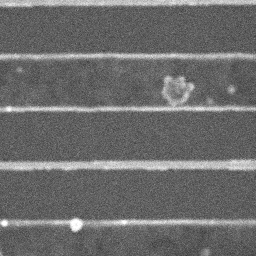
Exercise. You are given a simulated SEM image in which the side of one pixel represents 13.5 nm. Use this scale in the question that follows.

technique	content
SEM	lines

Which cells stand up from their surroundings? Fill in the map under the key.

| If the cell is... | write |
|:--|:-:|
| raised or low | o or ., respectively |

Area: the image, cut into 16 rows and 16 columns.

................
................
................
oo.ooooooooooooo
oooooooooooooooo
oooooooooooooooo
oooooooooooooooo
................
................
................
................
................
................
................
oooooooooooooooo
oooooooooooooooo